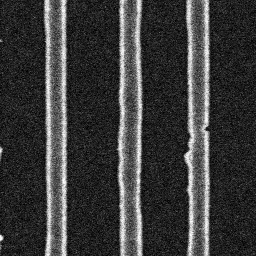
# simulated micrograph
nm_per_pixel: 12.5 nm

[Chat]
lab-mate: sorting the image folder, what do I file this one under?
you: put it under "one or a few lines or trenches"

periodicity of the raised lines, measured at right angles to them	889	nanometers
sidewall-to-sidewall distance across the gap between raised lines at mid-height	0.662	microns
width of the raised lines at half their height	206	nm